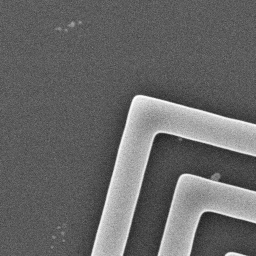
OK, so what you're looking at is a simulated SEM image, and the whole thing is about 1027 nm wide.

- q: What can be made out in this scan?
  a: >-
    groups of lines, slits or small figures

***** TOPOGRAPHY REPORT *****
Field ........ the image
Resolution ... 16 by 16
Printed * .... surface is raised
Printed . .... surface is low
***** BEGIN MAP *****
................
................
................
................
................
................
........***.....
........*******.
........**.*****
.......**......*
.......**.......
.......**..***..
.......**..*****
......**...**.**
......**..**....
......**..**....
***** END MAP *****